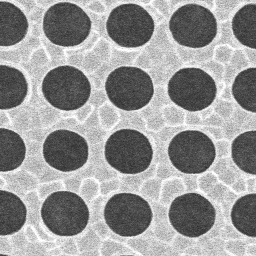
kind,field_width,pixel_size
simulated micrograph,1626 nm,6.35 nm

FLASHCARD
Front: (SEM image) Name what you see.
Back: a regular array of holes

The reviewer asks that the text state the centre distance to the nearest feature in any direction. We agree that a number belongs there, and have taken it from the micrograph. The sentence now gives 397 nanometers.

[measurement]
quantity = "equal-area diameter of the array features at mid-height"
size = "0.293 micrometres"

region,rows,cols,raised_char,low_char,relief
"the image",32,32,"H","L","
LLHHHHHLLHHHHHHLLHHHHHHHHHHHHHHH
LLLHHHLLLLLHHHLLLLHHHHLLLLHHHHLL
LLLHHLLLLLLHHLLLLLLHHLLLLLLHHLLL
LLLHHLLLLLLHHLLLLLLHHLLLLLLHHLLL
LLLHHHLLLLLHHHLLLLLHHHLLLLLHHLLL
LLHHHHHLLLHHHHHLLLHHHHLLLLHHHHLL
HHHHHHHHHHHHHHHHHHHHHHHHHHHHHHHH
HHHHHHHHHHHHHHHHHHHHHHHHHHHHHHHH
LLHHHHHLLLHHHHHLLHHHHHHLHHHHHHHL
LLLHHHLLLLLHHHLLLLLHHHLLLLHHHHLL
LLLHHLLLLLLHHLLLLLLHHLLLLLLHHLLL
LLLHHLLLLLLHHLLLLLLHHLLLLLLHHLLL
LLLHHHLLLLLHHHLLLLLHHLLLLLLHHLLL
LHHHHHHLLLHHHHHLLLHHHHHLLLHHHHLL
HHHHHHHHHHHHHHHHHHHHHHHHHHHHHHHH
HHHHHHHHHHHHHHHHHHHHHHHHHHHHHHHH
LLHHHHHLLHHHHHLLLHHHHHHLLHHHHHHL
LLLHHHLLLLLHHLLLLLLHHLLLLLHHHLLL
LLLHHLLLLLLHHLLLLLLHHLLLLLLHHLLL
LLLHHLLLLLLHHLLLLLLHHLLLLLLHHLLL
LLLHHHLLLLLHHHLLLLLHHHLLLLHHHLLL
HHHHHHHHHHHHHHHLLLHHHHHLLHHHHHHL
HHHHHHHHHHHHHHHHHHHHHHHHHHHHHHHH
HHHHHHHHHHHHHHHHHHHHHHHHHHHHHHHH
LLHHHHLLLLHHHHLLLHHHHHLLLHHHHHLL
LLLHHLLLLLLHHLLLLLLHHLLLLLHHHLLL
LLLHHLLLLLLHHLLLLLLHHLLLLLLHHLLL
LLLHHLLLLLLHHLLLLLLHHLLLLLLHHLLL
LLLHHHLLLLLHHHLLLLHHHHLLLLHHHLLL
HHHHHHHLLHHHHHHLLHHHHHHLLHHHHHHL
HHHHHHHHHHHHHHHHHHHHHHHHHHHHHHHH
HHHHHHHHHHHHHHHHHHHHHHHHHHHHHHHH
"